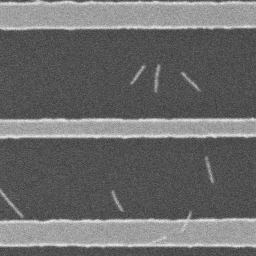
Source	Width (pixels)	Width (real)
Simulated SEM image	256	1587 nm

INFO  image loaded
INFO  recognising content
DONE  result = lines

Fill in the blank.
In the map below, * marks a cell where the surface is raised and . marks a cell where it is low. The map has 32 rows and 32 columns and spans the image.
********************************
********************************
********************************
***************************.*...
................................
................................
................................
................................
................................
................................
................................
................................
................................
................................
................................
********************************
********************************
................................
................................
................................
................................
................................
................................
................................
................................
................................
................................
..................*....*********
********************************
********************************
********************************
................................